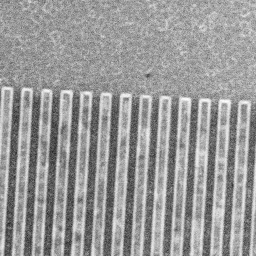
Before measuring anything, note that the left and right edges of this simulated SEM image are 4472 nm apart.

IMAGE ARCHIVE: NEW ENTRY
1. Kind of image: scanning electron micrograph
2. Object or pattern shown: parallel lines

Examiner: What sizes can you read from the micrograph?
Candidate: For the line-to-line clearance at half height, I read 0.188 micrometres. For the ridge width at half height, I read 155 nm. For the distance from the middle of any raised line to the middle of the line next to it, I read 345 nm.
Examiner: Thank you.